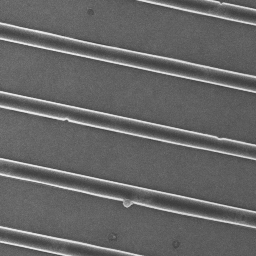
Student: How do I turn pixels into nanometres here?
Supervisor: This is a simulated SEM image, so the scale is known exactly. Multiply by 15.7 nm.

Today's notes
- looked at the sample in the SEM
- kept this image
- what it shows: one or a few lines or trenches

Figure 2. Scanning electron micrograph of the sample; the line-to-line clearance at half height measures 800 nm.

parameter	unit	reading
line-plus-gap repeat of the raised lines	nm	1040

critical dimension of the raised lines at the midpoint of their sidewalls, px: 14.9